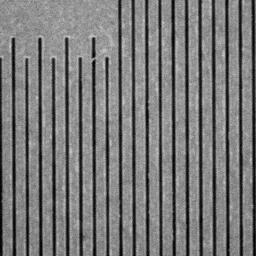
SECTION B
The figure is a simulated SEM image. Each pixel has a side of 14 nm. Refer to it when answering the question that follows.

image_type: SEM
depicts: parallel lines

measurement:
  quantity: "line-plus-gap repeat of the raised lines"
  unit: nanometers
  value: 187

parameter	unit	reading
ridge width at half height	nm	126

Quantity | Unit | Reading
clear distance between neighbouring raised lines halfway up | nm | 62.9